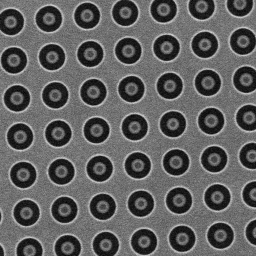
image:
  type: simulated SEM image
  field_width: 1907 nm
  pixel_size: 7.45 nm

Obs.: an array of small figures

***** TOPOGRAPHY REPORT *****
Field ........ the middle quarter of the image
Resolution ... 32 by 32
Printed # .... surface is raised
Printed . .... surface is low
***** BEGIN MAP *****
#####...########################
################################
#########################...####
###############....#####.....###
#####.....####......###...#...##
####......####..##..###..###..##
.###..##...##...##..###...#...##
.###..##...###......####.....###
.###......####.....######...####
.####.....######..##############
#######.########################
################################
#################.#######.....##
#######..######.....####......##
######.....####......###..##...#
.####...#..###...##..###..##..##
..###..##..###...##..###......##
..###..##..####......####.....##
..###......####.....############
.######...######################
################################
###########################..###
################....#####......#
#######....#####.....####..##..#
..####......###...#...###..##..#
..####..##..###..###..###..##..#
...###..##..###...#...###......#
...###......####.....#####....##
..#####....######..#############
.#######..######################
################################
###########################....#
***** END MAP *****